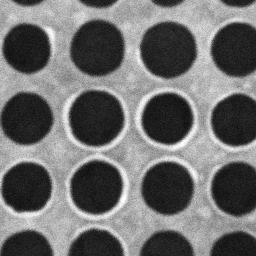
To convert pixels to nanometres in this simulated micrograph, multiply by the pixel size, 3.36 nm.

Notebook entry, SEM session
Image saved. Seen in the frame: holes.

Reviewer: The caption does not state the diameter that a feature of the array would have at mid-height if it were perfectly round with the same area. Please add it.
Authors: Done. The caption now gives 0.18 um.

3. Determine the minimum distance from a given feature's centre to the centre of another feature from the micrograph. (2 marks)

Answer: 233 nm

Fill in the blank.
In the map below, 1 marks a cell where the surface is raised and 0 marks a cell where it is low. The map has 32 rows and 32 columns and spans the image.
11000111110000111111001111110000
11111111111111111111111111111111
11111111111001111111111111111111
11000111110000011110000111110000
10000011100000011100000011100000
00000011100000001100000001000000
00000011100000001000000001000000
10000011100000011100000011100000
11000111110000011100000011100000
11111111111001111110001111110001
11111111111111111111111111111111
11111111111000111111111111111111
10000011100000011110000111110000
00000011100000011100000011100000
00000001100000001100000011000000
00000001100000001100000011000000
00000011100000011100000011100000
10000111110000111110000111100000
11111111111111111111111111111111
11111111111111111111111111111111
11000111111000111110000111110001
10000011100000011100000011100000
00000011100000011100000011100000
00000001100000011100000011000000
00000011100000011100000011000000
10000011100000011100000011100000
11001111111001111110000111110001
11111111111111111111111111111111
11111111111111111111111111111111
10000011110000111110000111110000
00000011100000011100000011100000
00000001100000011000000011000000